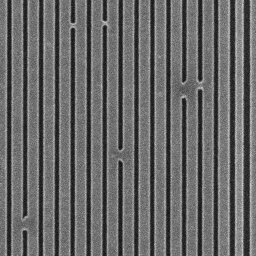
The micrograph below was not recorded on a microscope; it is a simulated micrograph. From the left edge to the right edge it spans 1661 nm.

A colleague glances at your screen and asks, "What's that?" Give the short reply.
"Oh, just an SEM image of parallel lines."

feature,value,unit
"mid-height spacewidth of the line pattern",31.6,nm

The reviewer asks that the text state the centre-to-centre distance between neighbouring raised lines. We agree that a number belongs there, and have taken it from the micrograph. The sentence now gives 103 nm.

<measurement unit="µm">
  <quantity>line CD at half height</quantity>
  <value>0.069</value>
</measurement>